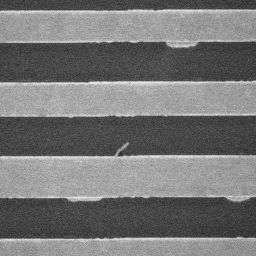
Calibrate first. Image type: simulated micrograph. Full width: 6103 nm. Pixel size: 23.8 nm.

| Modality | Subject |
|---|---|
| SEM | lines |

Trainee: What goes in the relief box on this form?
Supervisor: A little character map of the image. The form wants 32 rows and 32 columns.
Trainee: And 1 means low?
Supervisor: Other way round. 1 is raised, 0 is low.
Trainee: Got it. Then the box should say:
00000000000000000000000000000000
00111111111111111111111111111111
11111111111111111111111111111111
11111111111111111111111111111111
11111111111111111111111111111111
00000000000000000000000000000000
00000000000000000000000000000000
00000000000000000000000000000000
00000000000000000000000000000000
00000000000000000000000000000000
11111111111111111111111111111111
11111111111111111111111111111111
11111111111111111111111111111111
11111111111111111111111111111111
00000000100000000000000000000000
00000000000000000000000000000000
00000000000000000000000000000000
00000000000000000000000000000000
00000000000000000000000000000000
00000000000000000000000000000000
11111111111111111111111111111111
11111111111111111111111111111111
11111111111111111111111111111111
11111111111111111111111111111111
11111111111111111111111111111111
00000000000000000000000000000000
00000000000000000000000000000000
00000000000000000000000000000000
00000000000000000000000000000000
00000000000000000000000000000000
11111111111111111111111111111111
11111111111111111111111111111111